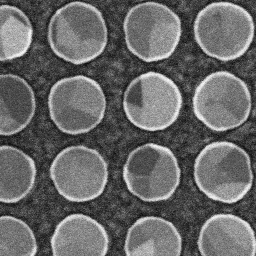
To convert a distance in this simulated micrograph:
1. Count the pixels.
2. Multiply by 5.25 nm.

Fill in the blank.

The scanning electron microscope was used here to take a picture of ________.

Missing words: a regular array of raised bodies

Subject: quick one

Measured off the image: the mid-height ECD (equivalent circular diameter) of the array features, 295 nanometers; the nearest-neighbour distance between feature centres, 370 nm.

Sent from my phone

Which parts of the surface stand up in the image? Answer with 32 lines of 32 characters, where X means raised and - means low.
---------XX-------XX--------X---
XXX----XXXXX----XXXXXX---XXXXXX-
XXX----XXXXXX---XXXXXX---XXXXXX-
XXXX--XXXXXXX---XXXXXXX-XXXXXXXX
XXXX--XXXXXXX---XXXXXX---XXXXXXX
XXXX--XXXXXXX---XXXXXX---XXXXXX-
XXX----XXXXX-----XXXX-----XXXX--
---------XX-------X-------------
--------------------------------
XX----------------XX------XXX---
XXX----XXXXX----XXXXXX---XXXXX--
XXXX--XXXXXXX---XXXXXX---XXXXXX-
XXXX--XXXXXXX---XXXXXX--XXXXXXX-
XXXX--XXXXXXX---XXXXXX--XXXXXXX-
XXXX--XXXXXXX---XXXXXX---XXXXXX-
XXX----XXXXX-----XXXX-----XXXX--
XX------XX----------------------
--------------------------------
XX-------XX------XXX------XXXX--
XXX----XXXXX----XXXXXX---XXXXXX-
XXXX---XXXXXX---XXXXXX--XXXXXXX-
XXXX--XXXXXXX---XXXXXX--XXXXXXX-
XXXX---XXXXXX---XXXXXX--XXXXXXX-
XXXX---XXXXXX---XXXXXX---XXXXXX-
XXX-----XXXX-----XXXX-----XXXX--
--------------------------------
--------------------------------
XX------XXXX------XX------XXXX--
XXXX---XXXXXX---XXXXXX---XXXXXX-
XXXX---XXXXXX---XXXXXX---XXXXXXX
XXXX---XXXXXX---XXXXXXX--XXXXXXX
XXXX---XXXXXX---XXXXXXX--XXXXXXX